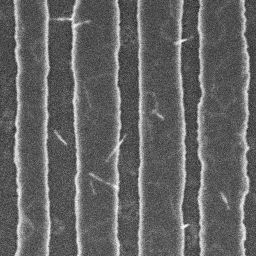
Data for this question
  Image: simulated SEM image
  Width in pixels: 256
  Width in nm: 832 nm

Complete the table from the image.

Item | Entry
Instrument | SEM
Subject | one or a few lines or trenches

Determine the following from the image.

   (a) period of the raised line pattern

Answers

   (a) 207 nm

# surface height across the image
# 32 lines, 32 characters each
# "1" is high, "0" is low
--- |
00111100001111100111111001111100
00111100011111100111111001111110
00111100011111100111111001111110
00111100011111100111111001111110
00111100011111100111111001111110
00111100011111100111111001111110
00111100011111100111110001111110
00111100011111100111110001111110
00111100011111100111110001111110
00111100011111100111111001111110
00111100011111100111111001111110
00111100011111100111111001111110
00111100011111100011111001111110
00111100011111100011111001111110
00111100011111100011111001111110
00111100011111100011111001111110
00111100011111100011111001111110
00111100001111100011111001111110
00111100001111100011111001111110
00111100001111100011111001111110
00111100001111000011111001111110
00111100001111100011111001111110
00111100001111100111111001111110
00111100001111100011111001111110
00111100001111100011111001111110
00111100001111100011111001111100
00011100001111100011111001111100
00011100001111100011111001111100
00111100001111100111111001111100
00111100001111100111111001111110
00111100001111100111111001111100
00111100001111100111111001111100